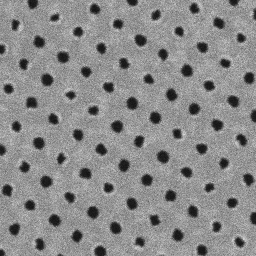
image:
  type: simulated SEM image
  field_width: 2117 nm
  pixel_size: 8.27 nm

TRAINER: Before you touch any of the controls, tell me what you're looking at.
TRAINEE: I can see a regular array of holes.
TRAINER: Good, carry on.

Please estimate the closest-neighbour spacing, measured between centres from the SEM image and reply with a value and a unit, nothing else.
226 nanometers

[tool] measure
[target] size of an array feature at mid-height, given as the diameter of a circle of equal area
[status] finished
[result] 93.4 nm